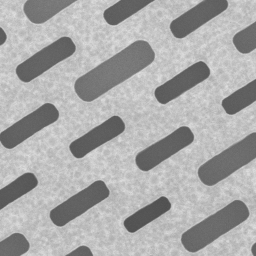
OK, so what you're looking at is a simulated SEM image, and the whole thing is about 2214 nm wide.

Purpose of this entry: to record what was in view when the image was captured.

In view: a regular array of holes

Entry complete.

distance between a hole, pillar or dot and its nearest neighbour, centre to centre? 592 nanometres